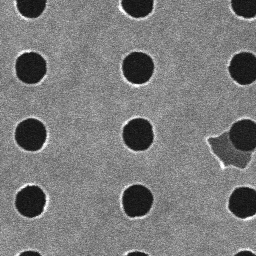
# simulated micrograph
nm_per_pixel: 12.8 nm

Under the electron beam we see holes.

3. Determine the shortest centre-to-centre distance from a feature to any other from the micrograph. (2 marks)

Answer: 848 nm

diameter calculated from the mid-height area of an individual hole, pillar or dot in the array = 0.42 um